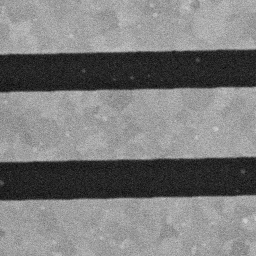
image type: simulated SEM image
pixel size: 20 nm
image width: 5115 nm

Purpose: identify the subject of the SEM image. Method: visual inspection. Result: lines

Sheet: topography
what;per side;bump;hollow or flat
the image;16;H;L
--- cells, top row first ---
HHHHHHHHHHHHHHHH
HHHHHHHHHHHHHHHH
HHHHHHHHHHHHHHHH
LLLLLLLLLLLLLLLL
LLLLLLLLLLLLLLLL
LLLLLLLLLLLLLLLH
HHHHHHHHHHHHHHHH
HHHHHHHHHHHHHHHH
HHHHHHHHHHHHHHHH
HHHHHHHHHHHHHHHH
LLLLLLLLLLLLLLLL
LLLLLLLLLLLLLLLL
LLLLHHHHHHHHHHHH
HHHHHHHHHHHHHHHH
HHHHHHHHHHHHHHHH
HHHHHHHHHHHHHHHH